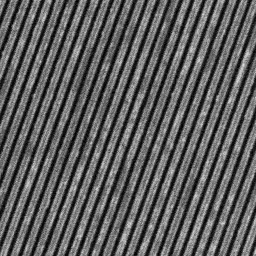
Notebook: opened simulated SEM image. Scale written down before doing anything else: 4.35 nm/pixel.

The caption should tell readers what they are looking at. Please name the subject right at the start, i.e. parallel lines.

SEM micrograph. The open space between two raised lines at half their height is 23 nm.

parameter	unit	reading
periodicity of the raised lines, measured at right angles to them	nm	47.1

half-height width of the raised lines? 26.6 nanometres